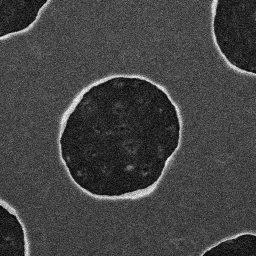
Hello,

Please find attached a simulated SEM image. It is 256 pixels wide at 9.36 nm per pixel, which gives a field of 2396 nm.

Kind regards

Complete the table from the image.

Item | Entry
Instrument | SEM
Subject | holes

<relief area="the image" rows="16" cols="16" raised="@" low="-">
---@@@@@@@@@@---
--@@@@@@@@@@@---
@@@@@@@@@@@@@@--
@@@@@@@@@@@@@@--
@@@@@@@@@@@@@@@-
@@@@@@----@@@@@@
@@@@@------@@@@@
@@@@-------@@@@@
@@@@-------@@@@@
@@@@-------@@@@@
@@@@------@@@@@@
@@@@@-----@@@@@@
@@@@@@@@@@@@@@@@
-@@@@@@@@@@@@@@@
-@@@@@@@@@@@@@@@
--@@@@@@@@@@@---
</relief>